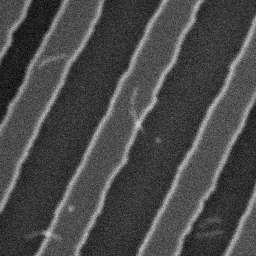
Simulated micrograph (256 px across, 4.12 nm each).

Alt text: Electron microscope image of lines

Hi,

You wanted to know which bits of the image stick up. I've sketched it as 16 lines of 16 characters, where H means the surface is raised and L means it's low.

HHLLHHLLLLHHLLLL
HLLHHHLLLHHHLLLL
HLLHHLLLLHHLLLLH
LLHHHLLLHHHLLLLH
LLHHLLLLHHLLLLHH
LHHHLLLHHHLLLLHH
LHHLLLLHHHLLLHHH
HHHLLLHHHLLLLHHL
HHLLLLHHLLLLHHHL
HHLLLHHHLLLLHHLL
HLLLLHHHLLLHHHLL
HLLLHHHLLLLHHLLL
LLLLHHLLLLHHHLLL
LLLHHHLLLLHHLLLH
LLLHHHLLLHHHLLLH
LLLHHLLLLHHLLLHH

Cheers